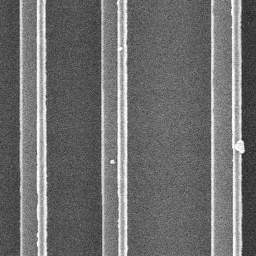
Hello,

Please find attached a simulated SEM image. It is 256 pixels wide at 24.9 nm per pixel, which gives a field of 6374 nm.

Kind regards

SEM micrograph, lines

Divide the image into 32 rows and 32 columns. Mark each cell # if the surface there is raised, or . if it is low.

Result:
...###.......###..........####..
...###.......###..........####..
...###.......###..........####..
...###.......###..........####..
...###.......###..........####..
...###.......###...........###..
...###.......###..........####..
...###.......###..........####..
...###.......###..........####..
...###.......###..........####..
...###.......###..........####..
...###.......###..........####..
...###.......###..........####..
...###.......###..........####..
...###.......###..........####..
...###.......###...........###..
...###.......###...........###..
...###.......###...........###..
...###.......###..........####..
...###.......###...........###..
...###.......###...........###..
...###.......###...........###..
...###.......###...........###..
...###.......###...........###..
...###.......###...........###..
...###.......###...........###..
...###.......###...........###..
...###.......###...........###..
...###.......###...........###..
...###.......###...........###..
...###.......###...........###..
...###.......###...........###..